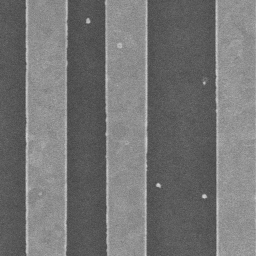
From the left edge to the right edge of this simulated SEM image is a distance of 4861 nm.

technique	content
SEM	lines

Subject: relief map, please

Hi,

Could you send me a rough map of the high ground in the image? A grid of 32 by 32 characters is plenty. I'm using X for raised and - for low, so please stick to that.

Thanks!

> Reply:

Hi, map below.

---XXXXX-----XXXXX---------XXXXX
---XXXXX-----XXXXX---------XXXXX
---XXXXX-----XXXXX---------XXXXX
---XXXXX-----XXXXX---------XXXXX
---XXXXX-----XXXXX---------XXXXX
---XXXXX-----XXXXX---------XXXXX
---XXXXX-----XXXXX---------XXXXX
---XXXXX-----XXXXX---------XXXXX
---XXXXX-----XXXXX---------XXXXX
---XXXXX-----XXXXX---------XXXXX
---XXXXX-----XXXXX---------XXXXX
---XXXXX-----XXXXX---------XXXXX
---XXXXX-----XXXXX---------XXXXX
---XXXXX-----XXXXX---------XXXXX
---XXXXX-----XXXXX---------XXXXX
---XXXXX-----XXXXX---------XXXXX
---XXXXX-----XXXXX---------XXXXX
---XXXXX-----XXXXX---------XXXXX
---XXXXX-----XXXXX---------XXXXX
---XXXXX-----XXXXX---------XXXXX
---XXXXX-----XXXXX---------XXXXX
---XXXXX-----XXXXX---------XXXXX
---XXXXX-----XXXXX---------XXXXX
---XXXXX-----XXXXX---------XXXXX
---XXXXX-----XXXXX---------XXXXX
---XXXXX-----XXXXX---------XXXXX
---XXXXX-----XXXXX---------XXXXX
---XXXXX-----XXXXX---------XXXXX
---XXXXX-----XXXXX---------XXXXX
---XXXXX-----XXXXX---------XXXXX
---XXXXX-----XXXXX---------XXXXX
---XXXXX-----XXXXX---------XXXXX